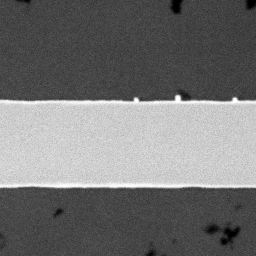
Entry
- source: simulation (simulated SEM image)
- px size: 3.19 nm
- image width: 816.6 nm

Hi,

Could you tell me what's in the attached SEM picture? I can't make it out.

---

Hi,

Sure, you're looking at wiring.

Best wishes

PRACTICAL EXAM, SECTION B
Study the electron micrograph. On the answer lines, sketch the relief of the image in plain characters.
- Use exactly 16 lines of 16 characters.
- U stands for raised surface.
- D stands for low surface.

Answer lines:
DDDDDDDDDDDDDDDD
DDDDDDDDDDDDDDDD
DDDDDDDDDDDDDDDD
DDDDDDDDDDDDDDDD
DDDDDDDDDDDDDDDD
DDDDDDDDDDDDDDDD
UUUUUUUUUUUUUUUU
UUUUUUUUUUUUUUUU
UUUUUUUUUUUUUUUU
UUUUUUUUUUUUUUUU
UUUUUUUUUUUUUUUU
UUUUUUUUUUUUUUUU
DDDDDDDDDDDDDDDD
DDDDDDDDDDDDDDDD
DDDDDDDDDDDDDDDD
DDDDDDDDDDDDDDDD